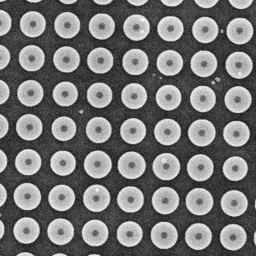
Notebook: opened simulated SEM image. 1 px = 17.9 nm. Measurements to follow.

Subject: an array of small figures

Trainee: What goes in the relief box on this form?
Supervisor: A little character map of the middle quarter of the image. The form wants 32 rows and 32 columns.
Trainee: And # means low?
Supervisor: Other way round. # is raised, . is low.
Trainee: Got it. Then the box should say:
###...######...######..#######..
##.....####....#####....#####...
.................##......###....
................................
................................
###....####.....###......##.....
###...######...#####....#####...
###...######..#######..######...
###...######..#######..######...
###...######...#####...######...
.......###......####....####....
................................
................................
#.......##......................
##....#####....####.....####....
###...######..######...######...
###...######..######...######..#
###...######..######...######..#
##....#####....#####...######..#
........##......###.....####....
................................
................................
##....#####....####......##.....
###...#####...######...#####....
###..#######..######..#######..#
###..#######..######..#######..#
##...#######..######..#######..#
#.....#####...#####....#####...#
................##......###.....
................................
#......##.......................
##....#####...#####....####.....